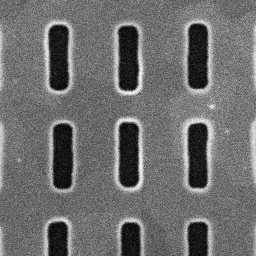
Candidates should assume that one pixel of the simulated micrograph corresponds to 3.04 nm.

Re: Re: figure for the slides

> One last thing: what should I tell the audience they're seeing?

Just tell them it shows holes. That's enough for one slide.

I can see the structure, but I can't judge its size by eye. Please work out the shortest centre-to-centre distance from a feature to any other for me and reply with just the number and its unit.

210 nm